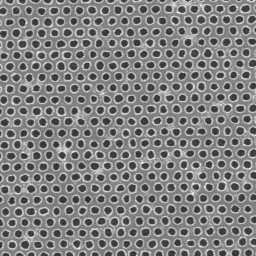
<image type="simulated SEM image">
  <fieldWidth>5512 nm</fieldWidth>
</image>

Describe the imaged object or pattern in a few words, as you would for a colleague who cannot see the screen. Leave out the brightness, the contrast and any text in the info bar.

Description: a regular array of holes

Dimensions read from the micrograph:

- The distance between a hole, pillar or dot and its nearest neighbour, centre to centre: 263 nm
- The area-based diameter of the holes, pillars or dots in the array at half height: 165 nm